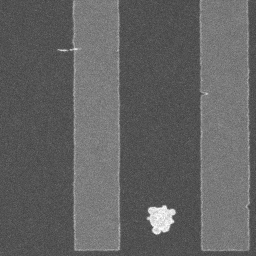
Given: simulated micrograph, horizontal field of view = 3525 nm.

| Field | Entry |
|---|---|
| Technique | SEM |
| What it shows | one or a few lines or trenches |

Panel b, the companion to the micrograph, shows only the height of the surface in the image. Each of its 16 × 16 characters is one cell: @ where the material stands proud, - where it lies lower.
@@@@@--@@@@@@--@
@@@@@--@@@@@@--@
@@@@@--@@@@@@---
@@@@@--@@@@@@--@
@@@@@--@@@@@@---
@@@@@--@@@@@@---
@@@@@--@@@@@@--@
@@@@@--@@@@@@--@
@@@@@--@@@@@@---
@@@@@--@@@@@@---
@@@@@--@@@@@@---
@@@@@--@@@@@@---
@@@@@--@@@@@@---
@@@@@--@@@@@@---
@@@@@--@@@@@@---
@@@@@--@@@@@@--@